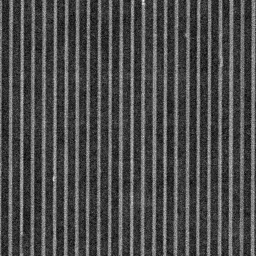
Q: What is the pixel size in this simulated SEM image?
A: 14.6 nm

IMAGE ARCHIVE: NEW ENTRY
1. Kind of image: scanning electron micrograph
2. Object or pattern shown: parallel lines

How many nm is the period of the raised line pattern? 161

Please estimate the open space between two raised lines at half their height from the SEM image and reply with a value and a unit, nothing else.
0.124 um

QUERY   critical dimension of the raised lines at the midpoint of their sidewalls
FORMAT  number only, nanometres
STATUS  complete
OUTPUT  36.6